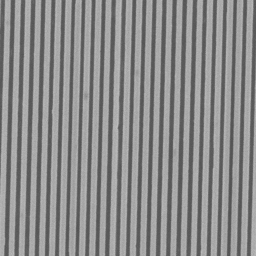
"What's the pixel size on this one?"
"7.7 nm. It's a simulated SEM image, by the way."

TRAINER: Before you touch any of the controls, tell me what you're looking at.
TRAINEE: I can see parallel lines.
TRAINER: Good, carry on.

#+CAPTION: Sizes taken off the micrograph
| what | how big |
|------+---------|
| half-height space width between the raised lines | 0.0356 microns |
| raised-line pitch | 77.8 nanometres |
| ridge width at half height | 43.3 nm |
